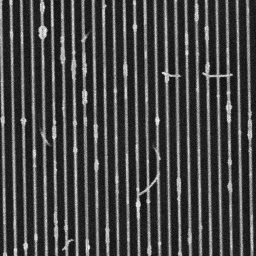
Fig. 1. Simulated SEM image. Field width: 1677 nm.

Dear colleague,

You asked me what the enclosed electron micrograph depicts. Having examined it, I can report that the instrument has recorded parallel lines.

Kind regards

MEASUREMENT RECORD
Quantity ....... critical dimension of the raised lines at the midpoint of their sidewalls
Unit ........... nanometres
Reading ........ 19.6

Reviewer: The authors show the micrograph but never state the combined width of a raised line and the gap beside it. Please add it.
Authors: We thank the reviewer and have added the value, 67.3 nanometers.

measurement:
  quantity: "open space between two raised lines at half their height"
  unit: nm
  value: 51.6